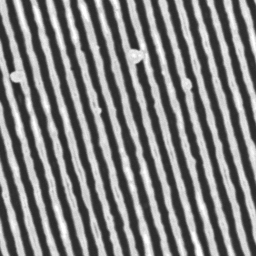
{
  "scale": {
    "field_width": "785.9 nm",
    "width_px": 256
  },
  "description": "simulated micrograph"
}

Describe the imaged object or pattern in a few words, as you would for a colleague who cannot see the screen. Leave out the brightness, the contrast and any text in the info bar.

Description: parallel lines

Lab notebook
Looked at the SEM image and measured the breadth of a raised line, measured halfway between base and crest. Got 7 pixels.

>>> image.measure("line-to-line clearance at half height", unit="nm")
24.4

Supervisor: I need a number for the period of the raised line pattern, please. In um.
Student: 0.0476